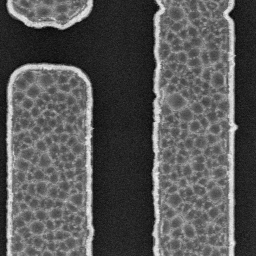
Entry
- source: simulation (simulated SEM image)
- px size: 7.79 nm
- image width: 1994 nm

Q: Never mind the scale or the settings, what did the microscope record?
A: one or a few lines or trenches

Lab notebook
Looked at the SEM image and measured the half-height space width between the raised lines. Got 522 nm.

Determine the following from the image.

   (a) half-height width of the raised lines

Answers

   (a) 0.595 micrometres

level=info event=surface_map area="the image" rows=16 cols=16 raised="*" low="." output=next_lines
.****.....****..
..**......****..
..........*****.
..........*****.
.****.....*****.
.*****....****..
.*****....****..
.*****....****..
.*****....****..
.*****....****..
.*****....****..
.*****....****..
.*****....****..
.*****....****..
.*****....****..
.*****....****..